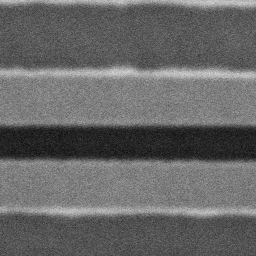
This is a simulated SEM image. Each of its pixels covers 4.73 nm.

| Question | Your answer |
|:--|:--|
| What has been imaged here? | lines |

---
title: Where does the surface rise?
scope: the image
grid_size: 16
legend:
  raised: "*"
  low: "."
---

................
................
................
................
................
****************
****************
****************
................
................
****************
****************
****************
................
................
................